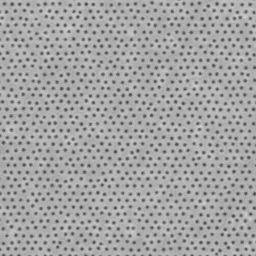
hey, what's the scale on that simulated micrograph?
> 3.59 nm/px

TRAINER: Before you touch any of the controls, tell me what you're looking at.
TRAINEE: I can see a regular array of holes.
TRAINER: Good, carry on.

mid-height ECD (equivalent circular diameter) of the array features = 0.0122 micrometres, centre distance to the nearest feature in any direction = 0.0252 microns